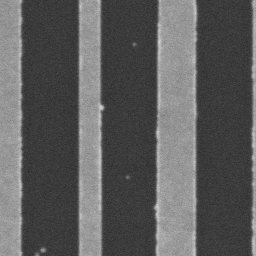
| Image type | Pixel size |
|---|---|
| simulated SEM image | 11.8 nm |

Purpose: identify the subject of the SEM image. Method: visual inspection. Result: lines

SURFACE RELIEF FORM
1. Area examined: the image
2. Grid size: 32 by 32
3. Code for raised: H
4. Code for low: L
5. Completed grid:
HHHLLLLLLLHHLLLLLLLLHHHHLLLLLLLL
HHHLLLLLLLHHLLLLLLLLHHHHLLLLLLLL
HHHLLLLLLLHHLLLLLLLLHHHHLLLLLLLL
HHHLLLLLLLHHLLLLLLLLHHHHLLLLLLLL
HHHLLLLLLLHHLLLLLLLLHHHHLLLLLLLL
HHHLLLLLLLHHLLLLLLLLHHHHLLLLLLLL
HHHLLLLLLLHHLLLLLLLLHHHHLLLLLLLL
HHHLLLLLLLHHLLLLLLLLHHHHLLLLLLLL
HHHLLLLLLLHHLLLLLLLLHHHHLLLLLLLL
HHHLLLLLLLHHLLLLLLLLHHHHLLLLLLLL
HHHLLLLLLLHHLLLLLLLLHHHHLLLLLLLL
HHHLLLLLLLHHLLLLLLLLHHHHLLLLLLLL
HHHLLLLLLLHHLLLLLLLLHHHHLLLLLLLL
HHHLLLLLLLHHLLLLLLLLHHHHLLLLLLLL
HHHLLLLLLLHHLLLLLLLLHHHHLLLLLLLL
HHHLLLLLLLHHHLLLLLLLHHHHLLLLLLLL
HHHLLLLLLLHHHLLLLLLLHHHHLLLLLLLL
HHHLLLLLLLHHHLLLLLLLHHHHLLLLLLLL
HHHLLLLLLLHHHLLLLLLLHHHHLLLLLLLL
HHHLLLLLLLHHHLLLLLLLHHHHLLLLLLLL
HHHLLLLLLLHHHLLLLLLLHHHHLLLLLLLL
HHHLLLLLLLHHHLLLLLLLHHHHLLLLLLLL
HHHLLLLLLLHHHLLLLLLLHHHHLLLLLLLL
HHHLLLLLLLHHHLLLLLLLHHHHLLLLLLLL
HHHLLLLLLLHHHLLLLLLLHHHHLLLLLLLL
HHHLLLLLLLHHHLLLLLLLHHHHLLLLLLLL
HHHLLLLLLLHHHLLLLLLLHHHHLLLLLLLL
HHHLLLLLLLHHHLLLLLLLHHHHLLLLLLLL
HHHLLLLLLLHHHLLLLLLLHHHHLLLLLLLL
HHHLLLLLLLHHHLLLLLLLHHHHLLLLLLLL
HHHLLLLLLLHHHLLLLLLLHHHHLLLLLLLL
HHHLLLLLLLHHHLLLLLLLHHHHLLLLLLLL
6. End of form